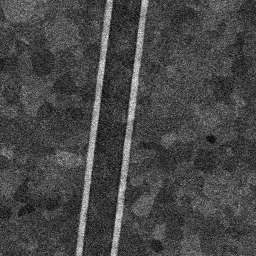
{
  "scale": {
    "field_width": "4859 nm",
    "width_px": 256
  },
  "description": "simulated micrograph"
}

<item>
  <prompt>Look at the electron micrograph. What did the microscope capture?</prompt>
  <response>one or a few lines or trenches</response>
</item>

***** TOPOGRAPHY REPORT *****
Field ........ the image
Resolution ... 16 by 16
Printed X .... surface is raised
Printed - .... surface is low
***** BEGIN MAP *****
XXXXXXX--XXXXXXX
XXXXXXX--XXXXXXX
XXXXXXX--XXXXXXX
XXXXXX---XXXXXXX
XXXXXX---XXXXXXX
XXXXXX--XXXXXXXX
XXXXXX--XXXXXXXX
XXXXXX--XXXXXXXX
XXXXXX--XXXXXXXX
XXXXXX--XXXXXXXX
XXXXXX--XXXXXXXX
XXXXX---XXXXXXXX
XXXXX---XXXXXXXX
XXXXX--XXXXXXXXX
XXXXX--XXXXXXXXX
XXXXX--XXXXXXXXX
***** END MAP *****